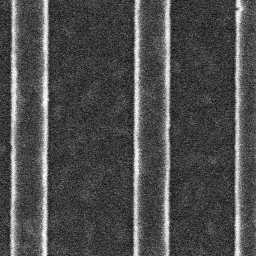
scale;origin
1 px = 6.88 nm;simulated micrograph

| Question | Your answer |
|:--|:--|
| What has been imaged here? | one or a few lines or trenches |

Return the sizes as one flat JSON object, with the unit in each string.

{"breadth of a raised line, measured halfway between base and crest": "230 nm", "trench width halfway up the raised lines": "78.4 px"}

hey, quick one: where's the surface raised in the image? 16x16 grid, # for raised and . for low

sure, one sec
.##......##....#
.##......##....#
.##......#.....#
.##......#.....#
.##.....###....#
.##.....###....#
.##.....###....#
.##.....###....#
.##.....##.....#
.##.....###....#
.##.....###....#
.##.....##.....#
.##.....##.....#
.##.....###....#
.##.....##.....#
.##.....##.....#